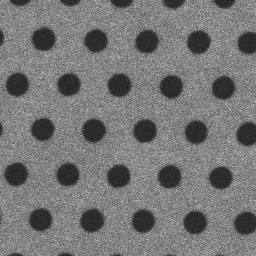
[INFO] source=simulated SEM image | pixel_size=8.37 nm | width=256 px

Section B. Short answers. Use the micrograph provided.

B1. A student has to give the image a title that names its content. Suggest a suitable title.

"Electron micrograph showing a regular array of holes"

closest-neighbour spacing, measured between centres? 428 nanometers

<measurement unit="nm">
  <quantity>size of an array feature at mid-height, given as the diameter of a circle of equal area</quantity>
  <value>196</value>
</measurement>